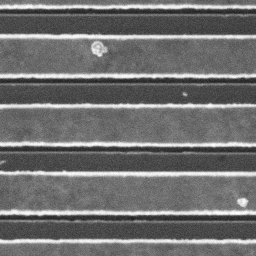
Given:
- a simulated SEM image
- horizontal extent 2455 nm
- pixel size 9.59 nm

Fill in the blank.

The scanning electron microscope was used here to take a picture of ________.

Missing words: lines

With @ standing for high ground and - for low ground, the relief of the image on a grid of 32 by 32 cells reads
@@@@@@@@@@@@@@@@@@@@@@@@@@@@@@@@
--------------------------------
--------------------------------
--------------------------------
@@@@@@@@@@@@@@@@@@@@@@@@@@@@@@@@
@@@@@@@@@@@@@@@@@@@@@@@@@@@@@@@@
@@@@@@@@@@@@@@@@@@@@@@@@@@@@@@@@
@@@@@@@@@@@@@@@@@@@@@@@@@@@@@@@@
@@@@@@@@@@@@@@@@@@@@@@@@@@@@@@@@
@@@@@@@@@@@@@@@@@@@@@@@@@@@@@@@@
--------------------------------
--------------------------------
--------------------------------
@@@@@@@@@@@@@@@@@@@@@@@@@@@@@@@@
@@@@@@@@@@@@@@@@@@@@@@@@@@@@@@@@
@@@@@@@@@@@@@@@@@@@@@@@@@@@@@@@@
@@@@@@@@@@@@@@@@@@@@@@@@@@@@@@@@
@@@@@@@@@@@@@@@@@@@@@@@@@@@@@@@@
--------------------------------
--------------------------------
--------------------------------
--------------------------------
@@@@@@@@@@@@@@@@@@@@@@@@@@@@@@@@
@@@@@@@@@@@@@@@@@@@@@@@@@@@@@@@@
@@@@@@@@@@@@@@@@@@@@@@@@@@@@@@@@
@@@@@@@@@@@@@@@@@@@@@@@@@@@@@@@@
@@@@@@@@@@@@@@@@@@@@@@@@@@@@@@@@
--------------------------------
--------------------------------
--------------------------------
@@@@@@@@@@@@@@@@@@@@@@@@@@@@@@@@
@@@@@@@@@@@@@@@@@@@@@@@@@@@@@@@@